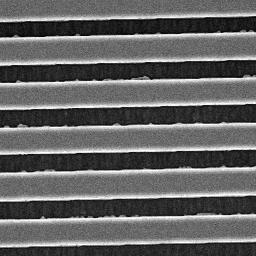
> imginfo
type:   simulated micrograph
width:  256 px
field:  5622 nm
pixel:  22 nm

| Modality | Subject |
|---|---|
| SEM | lines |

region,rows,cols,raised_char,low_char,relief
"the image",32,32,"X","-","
XXXXXXXXXXXXXXXXXXXXXXXXXXXXXXXX
XXXXXXXXXXXXXXXXXXXXXXXXXXXXXXXX
XXXXXXX-------------------------
--------------------------------
------------XXXXXXXXXXXXXXXXXXXX
XXXXXXXXXXXXXXXXXXXXXXXXXXXXXXXX
XXXXXXXXXXXXXXXXXXXXXXXXXXXXXXXX
XXXXXXXXXXXXXXXXXXXXXXXXXXXX----
--------------------------------
--------------------------------
XXXXXXXXXXXXXXXXXXXXXXXXXXXXXXXX
XXXXXXXXXXXXXXXXXXXXXXXXXXXXXXXX
XXXXXXXXXXXXXXXXXXXXXXXXXXXXXXXX
XXXXXXXXX-----------------------
--------------------------------
-----------------------------XXX
XXXXXXXXXXXXXXXXXXXXXXXXXXXXXXXX
XXXXXXXXXXXXXXXXXXXXXXXXXXXXXXXX
XXXXXXXXXXXXXXXXXXXXXXXXXXXXXXXX
--------------------------------
--------------------------------
----------XXXXXXXXXXXXXXXXXXXXXX
XXXXXXXXXXXXXXXXXXXXXXXXXXXXXXXX
XXXXXXXXXXXXXXXXXXXXXXXXXXXXXXXX
XXXXXXXXXXXXXXXXXXXXXXXX--------
--------------------------------
--------------------------------
-XXXXXXXXXXXXXXXXXXXXXXXXXXXXXXX
XXXXXXXXXXXXXXXXXXXXXXXXXXXXXXXX
XXXXXXXXXXXXXXXXXXXXXXXXXXXXXXXX
XXXXXXXXXXXXXX------------------
--------------------------------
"